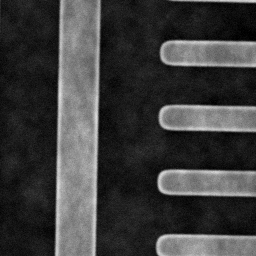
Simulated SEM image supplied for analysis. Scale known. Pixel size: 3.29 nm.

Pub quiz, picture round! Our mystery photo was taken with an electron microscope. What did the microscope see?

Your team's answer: groups of lines, slits or small figures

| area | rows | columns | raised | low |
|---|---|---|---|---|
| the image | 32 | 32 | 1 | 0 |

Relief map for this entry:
00000000111110000000000000000000
00000000111110000000000000000000
00000001111100000000000000000000
00000001111100000000000000000000
00000001111100000000000000000000
00000001111100000000111111111111
00000001111100000000111111111111
00000001111100000000111111111111
00000001111100000000000000000000
00000001111100000000000000000000
00000001111100000000000000000000
00000001111100000000000000000000
00000001111100000000000000000000
00000001111100000000111111111111
00000001111100000000111111111111
00000001111100000000111111111111
00000001111100000000000000000000
00000001111100000000000000000000
00000001111100000000000000000000
00000001111100000000000000000000
00000001111100000000000000000000
00000001111100000000111111111111
00000001111100000000111111111111
00000001111100000000111111111111
00000001111100000000000000000001
00000001111100000000000000000000
00000001111100000000000000000000
00000001111100000000000000000000
00000001111100000000000000000000
00000001111100000000111111100000
00000001111100000000111111111111
00000001111100000000111111111111